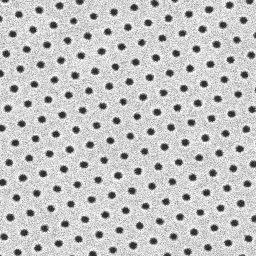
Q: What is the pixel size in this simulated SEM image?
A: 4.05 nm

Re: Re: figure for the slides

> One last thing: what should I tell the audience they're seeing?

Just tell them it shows a regular array of holes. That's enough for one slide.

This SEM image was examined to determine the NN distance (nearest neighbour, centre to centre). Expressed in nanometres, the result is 82.6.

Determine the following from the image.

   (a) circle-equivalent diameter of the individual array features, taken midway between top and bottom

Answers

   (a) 33.6 nanometers